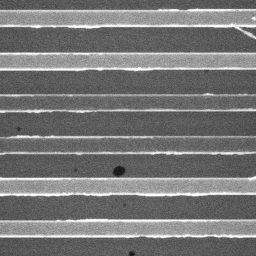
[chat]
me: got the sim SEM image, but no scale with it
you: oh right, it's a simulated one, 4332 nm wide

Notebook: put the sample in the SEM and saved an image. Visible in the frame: lines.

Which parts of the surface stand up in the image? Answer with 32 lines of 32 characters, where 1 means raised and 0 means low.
00000000000000000000000000000000
11111111111111111111111111111111
11111111111111111111111111111111
00000000000000000000000000000000
00000000000000000000000000000000
00000000000000000000000000000000
00000000000000000000000000000000
11111111111111111111111111111111
11111111111111111111111111111111
00000000000000000000000000000000
00000000000000000000000000000000
00000000000000000000000000000000
11111111111111111111111111111111
11111111111111111111111111111111
00000000000000000000000000000000
00000000000000000000000000000000
00000000000000000000000000000000
11111111111111111111111111111111
11111111111111111111111111111111
00000000000000000000000000000000
00000000000000000000000000000000
00000000000000000000000000000000
11111111111111111111111111111111
11111111111111111111111111111111
00000000000000000000000000000000
00000000000000000000000000000000
00000000000000000000000000000000
00000000000000000000000000000000
11111111111111111111111111111111
11111111111111111011110011010111
00000000000000000000000000000000
00000000000000000000000000000000